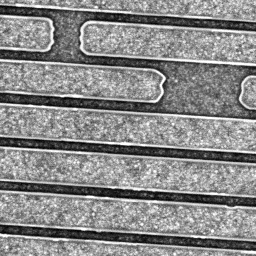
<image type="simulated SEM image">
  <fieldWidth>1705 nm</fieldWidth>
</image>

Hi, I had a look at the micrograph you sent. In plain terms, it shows parallel lines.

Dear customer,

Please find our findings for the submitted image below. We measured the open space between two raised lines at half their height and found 0.0698 um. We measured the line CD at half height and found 220 nanometres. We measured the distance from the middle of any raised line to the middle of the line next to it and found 292 nanometres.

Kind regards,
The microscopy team